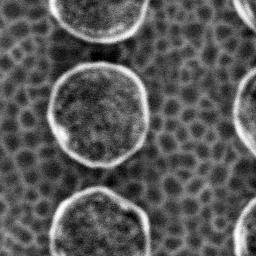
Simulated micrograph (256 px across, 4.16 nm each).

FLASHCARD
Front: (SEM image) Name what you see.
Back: raised bodies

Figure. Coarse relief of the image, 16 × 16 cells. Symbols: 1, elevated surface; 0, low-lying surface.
0001111110000001
0000111110000000
0000001000000000
0000000000000000
0000111100000000
0001111110000001
0001111110000001
0001111110000001
0000111110000001
0000111100000000
0000000000000000
0000000000000000
0000111100000000
0000111110000001
0001111110000001
0001111110000001